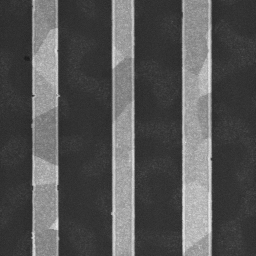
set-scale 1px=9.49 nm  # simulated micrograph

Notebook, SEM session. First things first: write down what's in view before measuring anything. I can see one or a few lines or trenches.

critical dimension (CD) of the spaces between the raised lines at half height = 53.5 px